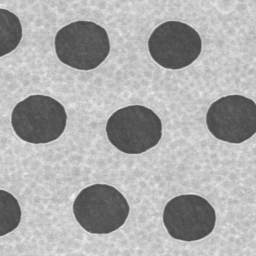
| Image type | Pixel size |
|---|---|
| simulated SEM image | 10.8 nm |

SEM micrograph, holes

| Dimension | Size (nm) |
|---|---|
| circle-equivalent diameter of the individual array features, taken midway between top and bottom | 567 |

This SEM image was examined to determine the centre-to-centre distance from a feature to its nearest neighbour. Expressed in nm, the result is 936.